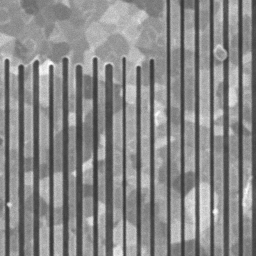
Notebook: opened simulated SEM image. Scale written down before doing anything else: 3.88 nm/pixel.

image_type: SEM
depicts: parallel lines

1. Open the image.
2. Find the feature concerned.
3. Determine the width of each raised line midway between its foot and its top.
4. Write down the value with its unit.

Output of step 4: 0.0359 microns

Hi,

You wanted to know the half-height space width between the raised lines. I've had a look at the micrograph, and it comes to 19.9 nanometers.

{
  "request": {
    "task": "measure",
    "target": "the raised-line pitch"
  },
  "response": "56.5 nm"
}